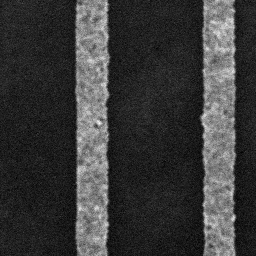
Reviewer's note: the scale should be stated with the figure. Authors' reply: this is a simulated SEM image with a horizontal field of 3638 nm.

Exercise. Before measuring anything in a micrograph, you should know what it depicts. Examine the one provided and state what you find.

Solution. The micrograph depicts one or a few lines or trenches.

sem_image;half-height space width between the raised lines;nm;1390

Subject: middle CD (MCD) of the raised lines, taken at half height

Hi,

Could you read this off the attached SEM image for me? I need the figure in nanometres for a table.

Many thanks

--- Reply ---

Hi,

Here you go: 414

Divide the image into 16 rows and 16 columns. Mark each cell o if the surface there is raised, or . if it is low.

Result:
.....oo......oo.
.....oo......oo.
.....oo......oo.
.....oo......oo.
.....o.......oo.
.....oo......oo.
.....oo......oo.
.....oo......oo.
.....oo......oo.
.....oo......oo.
.....oo......oo.
.....oo......oo.
.....oo......oo.
.....oo......oo.
.....oo......oo.
.....oo......oo.